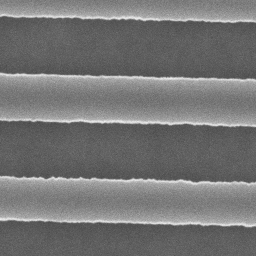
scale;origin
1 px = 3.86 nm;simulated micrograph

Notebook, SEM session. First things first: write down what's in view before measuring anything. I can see lines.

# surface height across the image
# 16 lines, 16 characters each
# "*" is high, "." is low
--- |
****************
................
................
................
................
****************
****************
****************
................
................
................
****************
****************
****************
................
................